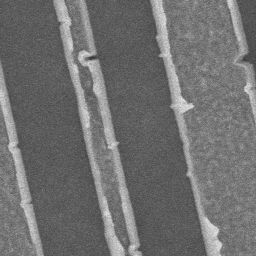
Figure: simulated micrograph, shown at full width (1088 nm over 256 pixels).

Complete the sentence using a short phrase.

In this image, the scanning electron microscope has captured one or a few lines or trenches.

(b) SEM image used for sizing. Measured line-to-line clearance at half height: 292 nm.